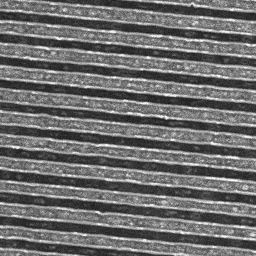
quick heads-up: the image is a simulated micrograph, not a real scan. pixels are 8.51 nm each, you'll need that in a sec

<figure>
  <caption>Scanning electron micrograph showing parallel lines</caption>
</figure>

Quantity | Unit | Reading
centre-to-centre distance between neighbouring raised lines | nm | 193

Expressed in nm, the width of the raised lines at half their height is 111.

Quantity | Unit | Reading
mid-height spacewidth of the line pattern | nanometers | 86.7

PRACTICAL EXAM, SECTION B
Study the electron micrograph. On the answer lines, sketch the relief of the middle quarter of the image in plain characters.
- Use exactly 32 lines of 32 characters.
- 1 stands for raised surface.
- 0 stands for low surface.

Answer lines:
00000000000111111111111111111111
00000000000000000000001111111111
11111100000000000000000000000000
11111111111111000000000000000000
11111111111111111111111100000000
01011111111111111111111111111111
00000000000001111111111111111111
00000000000000000000000111111111
11111111000000000000000000000000
11111111111111111100000000000000
11111111111111111111111111100000
00000001111111111111111111111111
00000000000000010111111111111111
00000000000000000000000001111111
11111111111000000000000000000000
11111111111111111111110000000000
01111111111111111111111111111111
00000000010111111111111111111111
00000000000000000000011111111111
11100000000000000000000000000001
11111111111110000000000000000000
11111111111111111111111100000000
00011111111111111111111111111111
00000000000000011111111111111111
00000000000000000000000001111111
11111110000000000000000000000000
11111111111111111000000000000000
11111111111111111111111111100000
00000000111111111111111111111111
00000000000000000111111111111111
00000000000000000000000000111111
11111111100000000000000000000000